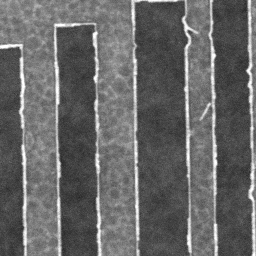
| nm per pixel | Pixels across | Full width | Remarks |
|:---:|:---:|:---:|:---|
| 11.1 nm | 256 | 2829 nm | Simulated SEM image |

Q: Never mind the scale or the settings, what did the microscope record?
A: one or a few lines or trenches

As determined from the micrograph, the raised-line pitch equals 850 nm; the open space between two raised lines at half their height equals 360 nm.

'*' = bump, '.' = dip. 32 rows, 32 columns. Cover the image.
.................******...*****.
.................******...*****.
.................******...*****.
.......*****.....*******..*****.
.......*****.....*******..*****.
.......*****.....*******...****.
***....*****.....******....****.
***....*****.....******....****.
***....*****.....******...*****.
***....*****.....******...*****.
***....*****.....******...*****.
***....*****.....******....*****
***....*****.....*******...*****
***....*****.....*******...****.
***....*****.....*******...****.
***....*****.....*******...*****
***....*****.....*******...*****
***....*****.....*******...*****
***....*****.....*******...*****
***....*****.....*******...*****
***....*****.....*******...*****
***....*****.....*******...*****
***....*****.....*******...*****
***....*****.....*******...*****
***....*****.....*******...****.
***....*****.....*******...*****
***....*****.....*******...*****
***....*****.....*******...*****
***....******....*******...*****
***....*****.....*******...*****
***....******....*******...*****
***....******....*******...*****